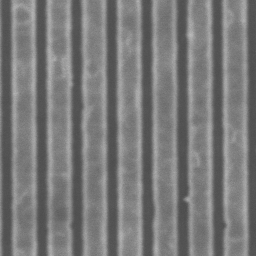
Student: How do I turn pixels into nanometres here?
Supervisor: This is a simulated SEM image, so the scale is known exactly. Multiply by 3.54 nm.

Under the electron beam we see parallel lines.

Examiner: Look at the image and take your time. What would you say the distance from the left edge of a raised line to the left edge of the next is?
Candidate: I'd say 35.2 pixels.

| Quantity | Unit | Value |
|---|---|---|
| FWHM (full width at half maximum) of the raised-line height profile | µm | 0.0817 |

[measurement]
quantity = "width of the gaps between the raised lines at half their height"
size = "12.1 pixels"